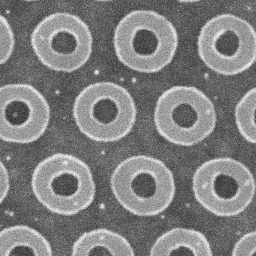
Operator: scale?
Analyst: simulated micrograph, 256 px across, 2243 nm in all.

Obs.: ring-shaped raised bodies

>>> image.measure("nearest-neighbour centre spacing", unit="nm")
700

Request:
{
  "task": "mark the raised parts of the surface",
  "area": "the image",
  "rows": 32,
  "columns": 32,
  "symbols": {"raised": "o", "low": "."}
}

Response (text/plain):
................................
.................oo.............
o....ooooo.....oooooo.....oooo..
o....oooooo....ooooooo...oooooo.
oo..ooo..oo...ooo...oo...oo...oo
oo..oo....o...oo....oo...oo...oo
o....oo..oo....oo..ooo...oo...oo
o....oooooo....oooooo....ooooooo
.......ooo.......ooo.......oooo.
................................
............oo..................
ooooo.....oooooo.....oooo......o
oooooo....oo..oo....oooooo....oo
o...oo...ooo...oo...oo..ooo...oo
o...oo...ooo...oo..oo....oo...oo
o..ooo....ooo.ooo...oo..ooo...oo
ooooo.....oooooo....oooooo....oo
.ooo.........o.......oooo......o
................................
.......oo.......................
.....ooooo.....ooooo......oooo..
o...ooooooo...ooooooo....oooooo.
o...ooo...o...oo...ooo..ooo..ooo
o...oo....oo..oo....oo..ooo...oo
o....oo..ooo...oo..ooo...oo..oo.
......ooooo....oooooo....oooooo.
.......oo........ooo.......ooo..
................................
..o.............................
ooooo.....ooooo.....ooooo......o
oooooo...ooooooo...ooooooo....oo
o...oo...oo...oo...oo...oo...ooo